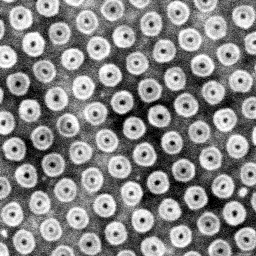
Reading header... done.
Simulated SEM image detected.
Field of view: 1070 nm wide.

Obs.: a regular array of ring-shaped raised bodies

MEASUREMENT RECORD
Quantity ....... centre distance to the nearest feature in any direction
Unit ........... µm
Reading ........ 0.12